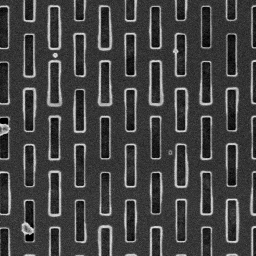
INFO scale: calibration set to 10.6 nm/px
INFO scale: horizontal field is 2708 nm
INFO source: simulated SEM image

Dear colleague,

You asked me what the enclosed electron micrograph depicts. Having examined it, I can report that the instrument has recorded groups of lines, slits or small figures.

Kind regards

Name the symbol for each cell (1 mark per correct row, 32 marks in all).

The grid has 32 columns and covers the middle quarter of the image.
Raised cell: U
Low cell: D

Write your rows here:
UUUDDUUUUDDUUUUDDDUUUUDDUUUUDDUU
UUUDDUUUUDDUUUUDDDUUUUDDUUUUDDUU
UUUDDUUUUDDUUUUUDDUUUUDDUUUUDDUU
UUUUUUUUUDDUUUUUUUUUUUDDUUUUUUUU
UUUUUUUUUDDUUUUUUUUUUUDDUUUUUUUU
UUUUUUUUUDDUUUUUUUUUUUDDUUUUUUUU
UUUDDUUUUDDUUUUUDDUUUUDDUUUUDDUU
UUUDDUUUUDDDUUUDDDUUUUDDUUUUDDDU
UUUDDUUUUDDDUUUDDDUUUDDDDUUUDDDU
UUUDDUUUUDDDUUUDDDUUUUDDUUUUDDDU
UUUDDUUUUUUUUUUDDDUUUUUUUUUUDDDU
UUUDDUUUUUUUUUUDDDUUUUUUUUUUDDDU
UUUDDUUUUUUUUUUDDDUUUUUUUUUUDDDU
UUUDDUUUUUDUUUUDDDUUUUDDUUUUDDDU
UUUDDUUUUDDUUUUDDDUUUUDDUUUUDDUU
UUUDDUUUUDDUUUUDDDUUUUDDUUUUDDUU
UUUDDUUUUDDUUUUUDDUUUUDDUUUUDDUU
UUUUUUUUUDDUUUUUUUUUUUDDUUUUUUUU
UUUUUUUUUDDUUUUUUUUUUUDDUUUUUUUU
UUUUUUUUUDDUUUUUUUUUUUDDUUUUUUUU
UUUDDUUUUDDUUUUUDDUUUUDDUUUUDDUU
UUUDDUUUUDDUUUUDDDUUUUDDUUUUDDUU
UUUDDUUUUDDUUUUDDDUUUUDDUUUUDDUU
UUUDDUUUUUDUUUUDDDUUUUDDUUUUDDUU
UUUDDUUUUUUUUUUDDDUUUUUUUUUUDDDU
UUUDDUUUUUUUUUUDDDUUUUUUUUUUDDDU
UUUDDUUUUUUUUUUDDDUUUUUUUUUUDDDU
UUUDDUUUUDDUUUUDDDUUUUDDUUUUDDDU
UUUDDUUUUDDUUUUDDDUUUUDDUUUUDDDU
UUUDDUUUUDDUUUUDDDUUUUDDUUUUDDDU
UUUDDUUUUDDUUUUUDDUUUUDDUUUUDDUU
UUUUUUUUUDDUUUUUUUUUUUDDUUUUUUUU